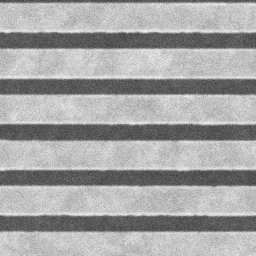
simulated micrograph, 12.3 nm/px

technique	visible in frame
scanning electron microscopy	lines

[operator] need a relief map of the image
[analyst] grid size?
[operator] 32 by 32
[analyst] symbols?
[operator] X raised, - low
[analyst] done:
XXXXXXXXXXXXXXXXXXXXXXXXXXXX-XXX
XXXXXXXXXXXXXXXXXXXXXXXXXXXXXXXX
XXXXXXXXXXXXXXXXXXXXXXXXXXXXXXXX
XXXXXXXXXXXXXXXXXXXXXXXXXXXXXXXX
--------------------------------
--------------------------------
XXXXXXXXXXXXXXXXXXXXXXXXXXXXXXXX
XXXXXXXXXXXXXXXXXXXXXXXXXXXXXXXX
XXXXXXXXXXXXXXXXXXXXXXXXXXXXXXXX
XXXXXXXXXXXXXXXXXXXXXXXXXXXXXXXX
--------------------------------
--------------------------------
XXXXXXXXXXXXXXXXXXXXXXXXXXXXXXXX
XXXXXXXXXXXXXXXXXXXXXXXXXXXXXXXX
XXXXXXXXXXXXXXXXXXXXXXXXXXXXXXXX
--------------------------------
--------------------------------
--------------------------------
XXXXXXXXXXXXXXXXXXXXXXXXXXXXXXXX
XXXXXXXXXXXXXXXXXXXXXXXXXXXXXXXX
XXXXXXXXXXXXXXXXXXXXXXXXXXXXXXXX
--------------------------------
--------------------------------
XXXXXXXXXXXXXXXXXXXXXXXXXXXXXXXX
XXXXXXXXXXXXXXXXXXXXXXXXXXXXXXXX
XXXXXXXXXXXXXXXXXXXXXXXXXXXXXXXX
XXXXXXXXXXXXXXXXXXXXXXXXXXXXXXXX
--------------------------------
--------------------------------
XXXXXXXXXXXXXXXXXXXXXXXXXXXXXXXX
XXXXXXXXXXXXXXXXXXXXXXXXXXXXXXXX
XXXXXXXXXXXXXXXXXXXXXXXXXXXXXXXX